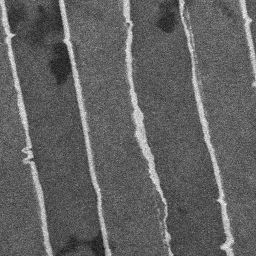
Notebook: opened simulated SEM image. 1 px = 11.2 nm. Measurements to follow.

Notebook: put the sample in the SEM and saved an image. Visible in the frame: one or a few lines or trenches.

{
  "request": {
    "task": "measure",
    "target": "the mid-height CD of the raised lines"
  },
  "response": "61.9 px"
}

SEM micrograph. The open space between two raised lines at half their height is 645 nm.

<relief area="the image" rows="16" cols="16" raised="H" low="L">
LLLLHHHHLLLHHHHL
LLLLHHHHLLLHHHHL
HLLLHHHHLLLLHHHH
HLLLHHHHLLLLHHHH
HLLLLHHHLLLLHHHH
HLLLLHHHLLLLHHHH
HLLLLHHHHLLLHHHH
HHLLLHHHHLLLLHHH
HHLLLHHHHLLLLHHH
HHLLLLHHHLLLLHHH
HHLLLLHHHLLLLHHH
HHLLLLHHHHLLLLHH
HHHLLLHHHHLLLLHH
HHHLLLHHHHLLLLHH
HHHLLLHHHHLLLLHH
HHHLLLLHHHHLLLHH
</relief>